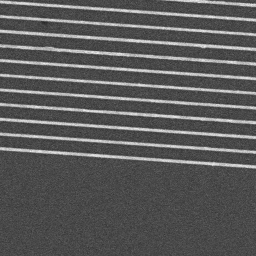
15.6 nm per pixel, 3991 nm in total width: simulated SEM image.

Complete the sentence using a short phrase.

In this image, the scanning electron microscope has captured parallel lines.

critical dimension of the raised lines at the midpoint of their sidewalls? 31.1 nm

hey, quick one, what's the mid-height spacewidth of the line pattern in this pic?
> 187 nm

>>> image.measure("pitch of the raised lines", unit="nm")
229